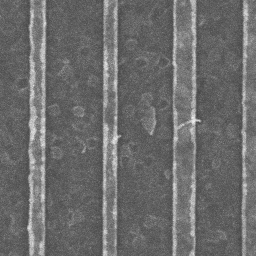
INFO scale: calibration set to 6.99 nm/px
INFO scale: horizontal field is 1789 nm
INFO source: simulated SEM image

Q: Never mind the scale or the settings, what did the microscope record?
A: one or a few lines or trenches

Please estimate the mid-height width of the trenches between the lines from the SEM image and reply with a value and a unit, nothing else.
398 nm